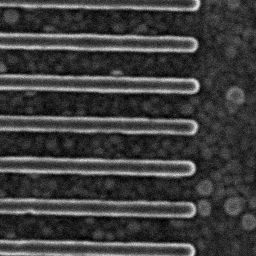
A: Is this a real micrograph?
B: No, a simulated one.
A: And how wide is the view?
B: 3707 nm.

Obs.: parallel lines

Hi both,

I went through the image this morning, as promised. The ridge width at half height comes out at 194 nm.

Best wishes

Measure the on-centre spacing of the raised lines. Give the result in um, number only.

0.599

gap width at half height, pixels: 27.6